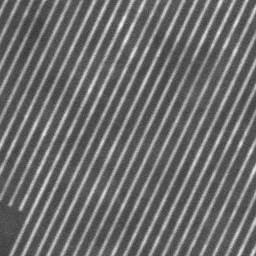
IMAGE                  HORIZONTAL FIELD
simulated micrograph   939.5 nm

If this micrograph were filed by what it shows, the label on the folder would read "parallel lines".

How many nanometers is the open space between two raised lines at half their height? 33.5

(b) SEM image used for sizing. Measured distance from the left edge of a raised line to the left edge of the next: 42 nanometres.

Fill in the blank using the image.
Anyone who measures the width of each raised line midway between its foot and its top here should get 7.8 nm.